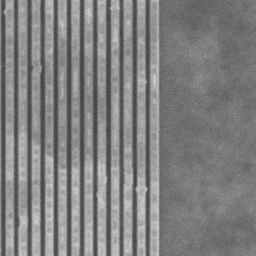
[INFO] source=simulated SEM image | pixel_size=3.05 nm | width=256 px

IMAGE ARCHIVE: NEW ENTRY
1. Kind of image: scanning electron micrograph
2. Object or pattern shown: parallel lines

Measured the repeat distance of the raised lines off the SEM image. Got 40.1 nm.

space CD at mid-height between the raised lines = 16.4 nm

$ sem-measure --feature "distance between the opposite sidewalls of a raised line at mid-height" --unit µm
0.0221